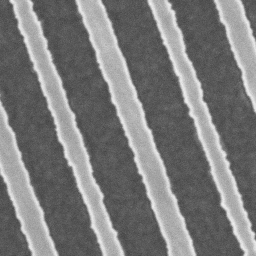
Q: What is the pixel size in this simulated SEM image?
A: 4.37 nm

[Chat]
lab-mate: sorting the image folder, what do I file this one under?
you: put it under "lines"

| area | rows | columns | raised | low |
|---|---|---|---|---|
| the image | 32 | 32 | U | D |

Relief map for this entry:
DDUUDDDDDDUUUDDDDDDUUDDDDDDUUUDD
DDUUDDDDDDUUUDDDDDDUUUDDDDDUUUUD
DDUUUDDDDDUUUUDDDDDUUUDDDDDDUUUD
DDUUUDDDDDDUUUDDDDDDUUDDDDDDUUUD
DDDUUUDDDDDUUUDDDDDDUUUDDDDDUUUU
DDDUUUDDDDDUUUUDDDDDDUUDDDDDDUUU
DDDDUUDDDDDDUUUDDDDDDUUDDDDDDUUU
DDDDUUDDDDDDUUUUDDDDDUUUDDDDDDUU
DDDDUUUDDDDDDUUUDDDDDDUUDDDDDDUU
DDDDDUUDDDDDDUUUDDDDDDUUUDDDDDUU
DDDDDUUUDDDDDDUUUDDDDDDUUDDDDDDU
DDDDDUUUDDDDDDUUUDDDDDDUUDDDDDDU
DDDDDDUUDDDDDDUUUDDDDDDUUDDDDDDU
DDDDDDUUUDDDDDDUUUDDDDDDUUDDDDDD
UDDDDDDUUDDDDDDUUUDDDDDDUUDDDDDD
UDDDDDDUUDDDDDDUUUDDDDDDUUUDDDDD
UUDDDDDUUUDDDDDDUUUDDDDDDUUDDDDD
UUDDDDDUUUDDDDDDUUUDDDDDDUUDDDDD
UUDDDDDDUUUDDDDDUUUDDDDDDUUUDDDD
UUUDDDDDUUUDDDDDDUUUDDDDDDUUDDDD
UUUDDDDDDUUDDDDDDUUUDDDDDDUUUDDD
UUUDDDDDDUUDDDDDDUUUUDDDDDUUUDDD
DUUUDDDDDDUUDDDDDDUUUDDDDDDUUDDD
DUUUDDDDDDUUDDDDDDUUUDDDDDDUUUDD
DUUUDDDDDDUUUDDDDDDUUUDDDDDDUUDD
DDUUUDDDDDDUUDDDDDDUUUDDDDDDUUDD
DDUUUDDDDDDUUDDDDDDUUUDDDDDDUUUD
DDUUUUDDDDDUUUDDDDDDUUUDDDDDDUUD
DDDUUUDDDDDDUUDDDDDDUUUDDDDDDUUD
DDDUUUDDDDDDUUUDDDDDUUUUDDDDDDUU
DDDDUUUDDDDDUUUDDDDDDUUUDDDDDDUU
DDDDUUUDDDDDDUUDDDDDDUUUDDDDDDDU